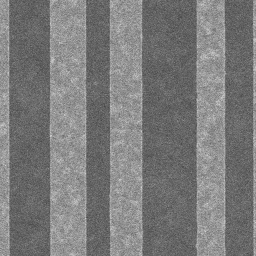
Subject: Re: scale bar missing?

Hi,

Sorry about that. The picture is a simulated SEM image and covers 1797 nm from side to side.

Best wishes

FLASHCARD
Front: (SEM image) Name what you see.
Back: one or a few lines or trenches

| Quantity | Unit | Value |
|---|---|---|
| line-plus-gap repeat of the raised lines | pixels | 71.4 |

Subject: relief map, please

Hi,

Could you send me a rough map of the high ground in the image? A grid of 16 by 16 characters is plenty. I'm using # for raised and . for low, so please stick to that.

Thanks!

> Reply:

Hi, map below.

#..##..##...##..
#..##..##...##..
#..##..##...##..
#..##..##...##..
#..##..##...##..
#..##..##...##..
#..##..##...##..
#..##..##...##..
#..##..##...##..
#..##..##...##..
#..##..##...##..
#..##..##...##..
#..##..##...##..
#..##..##...##..
#..##..##...##..
#..##..##...##..